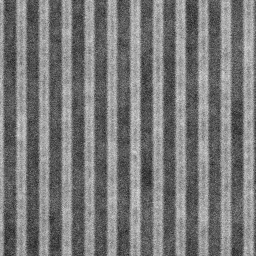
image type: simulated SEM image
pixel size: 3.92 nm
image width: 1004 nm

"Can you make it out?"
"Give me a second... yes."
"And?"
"parallel lines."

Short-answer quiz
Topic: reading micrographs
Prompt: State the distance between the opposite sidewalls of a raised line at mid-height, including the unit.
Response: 34.8 nanometres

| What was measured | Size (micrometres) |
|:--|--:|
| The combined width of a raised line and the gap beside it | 0.0889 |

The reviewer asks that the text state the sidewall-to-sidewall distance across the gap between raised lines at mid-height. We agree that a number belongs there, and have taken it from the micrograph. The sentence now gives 54.4 nm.